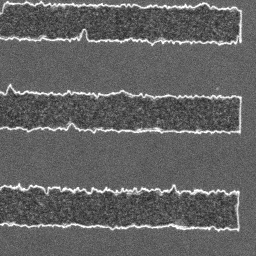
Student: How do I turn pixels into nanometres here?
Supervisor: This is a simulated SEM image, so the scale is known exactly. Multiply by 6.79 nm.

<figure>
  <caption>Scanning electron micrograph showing one or a few lines or trenches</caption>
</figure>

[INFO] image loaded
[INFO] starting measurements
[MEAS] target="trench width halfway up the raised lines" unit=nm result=377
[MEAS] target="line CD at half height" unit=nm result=238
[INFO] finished